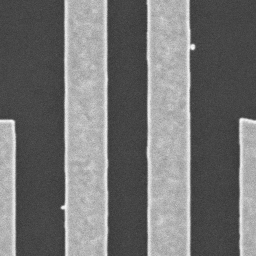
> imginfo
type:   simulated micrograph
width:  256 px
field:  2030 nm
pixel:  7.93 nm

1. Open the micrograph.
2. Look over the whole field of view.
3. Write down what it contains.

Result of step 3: wiring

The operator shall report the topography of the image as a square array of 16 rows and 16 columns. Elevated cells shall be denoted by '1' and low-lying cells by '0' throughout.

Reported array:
0000111001110000
0000111001110000
0000111001110000
0000111001110000
0000111001110000
0000111001110000
0000111001110000
0000111001110001
1000111001110001
1000111001110001
1000111001110001
1000111001110001
1000111001110001
1000111001110001
1000111001110001
1000111001110001